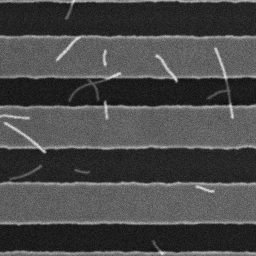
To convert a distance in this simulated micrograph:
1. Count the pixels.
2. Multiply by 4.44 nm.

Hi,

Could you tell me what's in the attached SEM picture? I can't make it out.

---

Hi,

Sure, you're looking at lines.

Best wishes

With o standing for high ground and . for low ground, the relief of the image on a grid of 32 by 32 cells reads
................................
................................
................................
................................
o..oooooo.ooo.o.o...oooo...ooooo
oooooooooooooooooooooooooooooooo
oooooooooooooooooooooooooooooooo
oooooooooooooooooooooooooooooooo
oooooooooooooooooooooooooooooooo
oooooooooooooooooooooooooooooooo
................................
................................
................................
oooooooooooooooooooooooooooooooo
oooooooooooooooooooooooooooooooo
oooooooooooooooooooooooooooooooo
oooooooooooooooooooooooooooooooo
oooooooooooooooooooooooooooooooo
ooooooooooooooooooo.o..ooooooo..
................................
................................
................................
................................
oooooooooooooooooooooooooooooooo
oooooooooooooooooooooooooooooooo
oooooooooooooooooooooooooooooooo
oooooooooooooooooooooooooooooooo
oooooooooooooooooooooooooooooooo
................................
................................
................................
ooooooooo..ooooooo.ooo.oooooo.o.